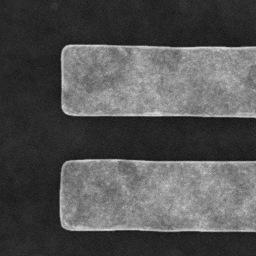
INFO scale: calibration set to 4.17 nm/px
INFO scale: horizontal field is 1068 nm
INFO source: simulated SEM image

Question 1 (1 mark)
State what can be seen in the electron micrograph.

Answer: wiring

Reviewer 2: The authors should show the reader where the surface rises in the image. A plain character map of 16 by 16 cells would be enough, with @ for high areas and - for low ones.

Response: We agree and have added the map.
----------------
----------------
----------------
----@@@@@@@@@@@@
----@@@@@@@@@@@@
----@@@@@@@@@@@@
----@@@@@@@@@@@@
----------------
----------------
----------------
----@@@@@@@@@@@@
----@@@@@@@@@@@@
----@@@@@@@@@@@@
----@@@@@@@@@@@@
----------------
----------------